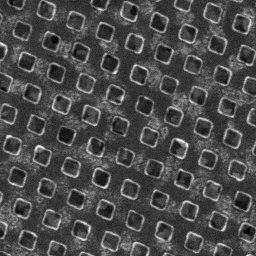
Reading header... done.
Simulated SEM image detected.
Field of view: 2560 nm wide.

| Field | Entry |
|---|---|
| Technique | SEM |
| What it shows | a regular array of raised bodies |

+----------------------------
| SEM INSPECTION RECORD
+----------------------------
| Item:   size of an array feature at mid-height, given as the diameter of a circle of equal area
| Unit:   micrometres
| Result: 0.181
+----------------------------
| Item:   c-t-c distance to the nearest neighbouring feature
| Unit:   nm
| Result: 311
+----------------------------